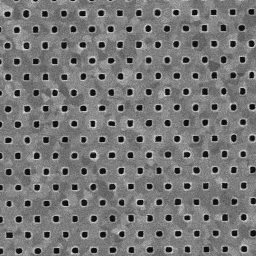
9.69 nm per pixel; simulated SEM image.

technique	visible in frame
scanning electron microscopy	a regular array of holes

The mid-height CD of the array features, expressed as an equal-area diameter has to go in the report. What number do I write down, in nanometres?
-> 64.7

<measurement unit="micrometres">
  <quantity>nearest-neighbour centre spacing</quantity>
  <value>0.175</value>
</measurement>